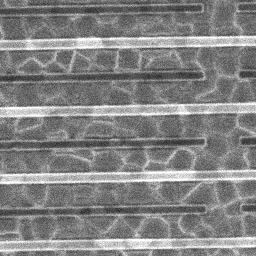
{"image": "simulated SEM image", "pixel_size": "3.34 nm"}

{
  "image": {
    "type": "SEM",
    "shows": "parallel lines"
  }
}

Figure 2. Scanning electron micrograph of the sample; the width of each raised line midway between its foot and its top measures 29.2 nanometres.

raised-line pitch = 0.112 microns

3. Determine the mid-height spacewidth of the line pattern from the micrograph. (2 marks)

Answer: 0.0838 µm